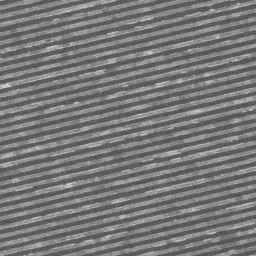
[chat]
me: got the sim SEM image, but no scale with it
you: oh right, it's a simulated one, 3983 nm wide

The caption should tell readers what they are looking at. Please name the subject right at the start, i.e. parallel lines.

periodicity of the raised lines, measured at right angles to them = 8.57 pixels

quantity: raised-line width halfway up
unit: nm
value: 51.2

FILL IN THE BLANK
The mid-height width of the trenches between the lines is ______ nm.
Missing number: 77.7